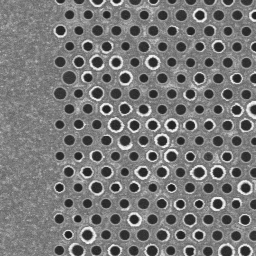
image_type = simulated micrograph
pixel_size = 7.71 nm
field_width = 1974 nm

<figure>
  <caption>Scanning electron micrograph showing a regular array of holes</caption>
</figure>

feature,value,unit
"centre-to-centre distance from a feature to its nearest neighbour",139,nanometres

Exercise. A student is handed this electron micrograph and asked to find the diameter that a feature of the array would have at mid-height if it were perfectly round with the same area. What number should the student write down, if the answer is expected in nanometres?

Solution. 74.9